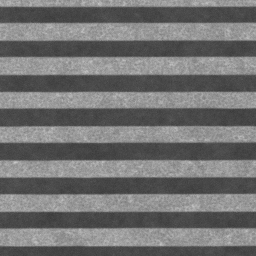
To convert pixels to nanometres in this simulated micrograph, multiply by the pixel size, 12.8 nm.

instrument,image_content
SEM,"parallel lines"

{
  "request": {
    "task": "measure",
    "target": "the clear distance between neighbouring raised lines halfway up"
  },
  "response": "0.223 micrometres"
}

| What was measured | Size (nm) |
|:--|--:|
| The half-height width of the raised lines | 201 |